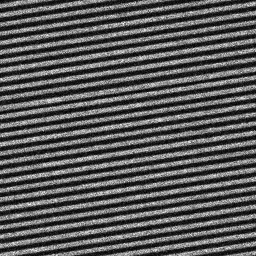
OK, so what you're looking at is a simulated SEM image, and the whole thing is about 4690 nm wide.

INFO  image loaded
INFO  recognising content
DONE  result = parallel lines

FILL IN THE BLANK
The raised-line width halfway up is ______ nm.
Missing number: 76.9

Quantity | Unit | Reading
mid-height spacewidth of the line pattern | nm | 92.8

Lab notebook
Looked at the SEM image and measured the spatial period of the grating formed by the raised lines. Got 167 nanometres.